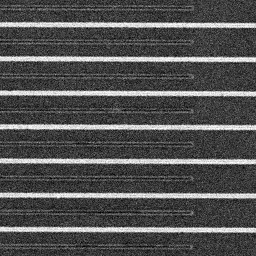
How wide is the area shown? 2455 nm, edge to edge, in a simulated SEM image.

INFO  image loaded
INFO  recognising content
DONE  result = parallel lines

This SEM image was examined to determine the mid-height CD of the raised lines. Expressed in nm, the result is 26.4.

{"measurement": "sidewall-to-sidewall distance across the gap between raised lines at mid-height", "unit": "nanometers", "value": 133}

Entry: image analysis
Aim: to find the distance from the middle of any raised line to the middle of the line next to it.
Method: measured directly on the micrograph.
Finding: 164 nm